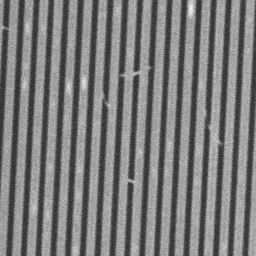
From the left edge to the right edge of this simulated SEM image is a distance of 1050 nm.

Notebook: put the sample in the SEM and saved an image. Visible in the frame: parallel lines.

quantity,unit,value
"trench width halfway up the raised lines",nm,27.1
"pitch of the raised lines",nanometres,60.4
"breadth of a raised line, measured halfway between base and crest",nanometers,30.7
